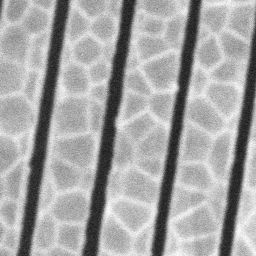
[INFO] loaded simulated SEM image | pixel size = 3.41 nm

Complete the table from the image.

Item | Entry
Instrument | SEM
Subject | one or a few lines or trenches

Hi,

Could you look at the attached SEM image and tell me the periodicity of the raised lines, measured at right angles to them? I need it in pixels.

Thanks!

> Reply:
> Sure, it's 66.2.